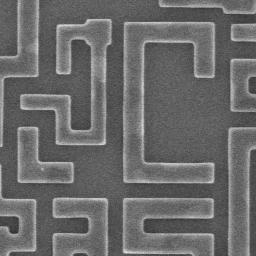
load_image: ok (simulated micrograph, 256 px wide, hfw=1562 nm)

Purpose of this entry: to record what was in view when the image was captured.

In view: wiring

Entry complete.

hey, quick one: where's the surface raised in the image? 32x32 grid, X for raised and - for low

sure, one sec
--XXX---------------XXXXXXXXXXXX
--XXX-----------------------XXXX
--XXX------XXX------------------
--XXX--XXXXXXX--XXXXXXXXXXX--XXX
--XXX--XXXXXXX--XXXXXXXXXXX--XXX
--XXX--XX--XXX-XXX------XXX-----
--XXX--XX--XX--XXX------XXX-----
XXXXX--XX--XX--XXX------XXX--XXX
XXXXX--XX--XX--XXX------XXX--XXX
XXXX-------XX---XX-------XX--XXX
-----------XX---XX-----------XX-
-----------XX--XXX-----------XX-
---XXXXXX--XX--XXX-----------XXX
---XXXXXX--XX--XXX-----------XXX
-------XX--XX--XXX--------------
-------XX--XX--XXX--------------
--XXX--XXXXXX--XXX-----------XXX
--XXX--XXXXXX--XXX-----------XXX
--XXX----------XXX-----------XXX
--XXX----------XXX-----------XX-
--XXXXXXX------XXXXXXXXXXX---XX-
--XXXXXXX------XXXXXXXXXXXX--XX-
--XXXXXXX-------XXXXXXXXXXX--XX-
-----------------------------XX-
-----------------------------XX-
XXXX---XXXXXX--XXXXXXXXXXXX--XX-
XXXX---XXXXXX--XXXXXXXXXXXX--XX-
--XX-------XX--XXX-----------XX-
X-XX-------XX--XXX-----------XX-
XXXX---XXXXXX--XXXXXXXXXXX---XX-
XXXX---XXXXXX--XXXXXXXXXXXX--XX-
XX-----XXXXXX---XXXXXXXXXXX--XX-